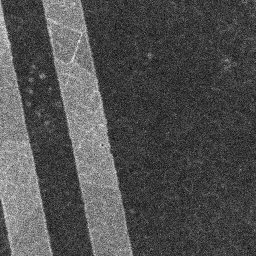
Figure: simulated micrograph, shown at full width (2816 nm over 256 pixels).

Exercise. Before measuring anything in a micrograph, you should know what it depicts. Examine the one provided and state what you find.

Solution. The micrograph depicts one or a few lines or trenches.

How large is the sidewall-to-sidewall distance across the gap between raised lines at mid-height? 457 nanometres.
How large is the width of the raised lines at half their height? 406 nanometers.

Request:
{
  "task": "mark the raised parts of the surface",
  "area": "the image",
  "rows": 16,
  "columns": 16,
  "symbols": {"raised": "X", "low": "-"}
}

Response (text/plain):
---XX-----------
---XX-----------
X--XX-----------
X--XXX----------
X---XX----------
X---XX----------
X---XX----------
XX--XXX---------
XX--XXX---------
XX---XX---------
XX---XX---------
XX---XX---------
XXX--XXX--------
XXX--XXX--------
-XX---XX--------
-XX---XX--------